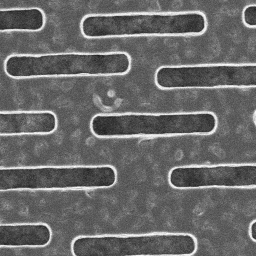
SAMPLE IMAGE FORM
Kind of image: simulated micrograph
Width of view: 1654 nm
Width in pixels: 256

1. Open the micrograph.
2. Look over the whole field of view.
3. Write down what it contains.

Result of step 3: holes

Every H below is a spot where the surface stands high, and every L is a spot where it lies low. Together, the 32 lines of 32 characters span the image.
HHHHHHHHHHHHHHHHHHHHHHHHHHHHHHHH
LLLLLHHHHHHHHHHHHHHHHHHHHHHHHHHL
LLLLLLHHHHLLLLLLLLLLLLLLLLHHHHHL
LLLLLHHHHHLLLLLLLLLLLLLLLLHHHHHH
HHHHHHHHHHHLLLLHHHHHHHHHHHHHHHHH
HHHHHHHHHHHHHHHHHHHHHHHHHHHHHHHH
HHHHHHHHHHHHHHHHHHHHHHHHHHHHHHHH
HLLLLLLLLLLLLLLLHHHHHHHHHHHHHHHH
HLLLLLLLLLLLLLLLHHHHLLLLLLLLLLLL
HHLLLHLLHHHHHHHHHHHHLLLLLLLLLLLL
HHHHHHHHHHHHHHHHHHHHLLLLLLLLLLLL
HHHHHHHHHHHHHHHHHHHHHHHHHHHHHHHH
HHHHHHHHHHHHHHHHHHHHHHHHHHHHHHHH
HHHHHHHHHHHHHHHHHHHHHHHHHHHHHHHH
LLLLLLLHHHHHLLLLLLLLLLLLLLLHHHHH
LLLLLLLHHHHHLLLLLLLLLLLLLLLHHHHH
LLLLLLHHHHHHLLLLLLLLLLLLLLHHHHHH
HHHHHHHHHHHHHHHHHHHHHHHHHHHHHHHH
HHHHHHHHHHHHHHHHHHHHHHHHHHHHHHHH
HHHHHHHHHHHHHHHHHHHHHHHHHHHHHHHH
HHHHHHHHHHHHHHHHHHHHHHHHHHHHHHHH
LLLLLLLLLLLLLLHHHHHHHLLLLLLLLLLL
LLLLLLLLLLLLLLHHHHHHHLLLLLLLLLLL
LLLLLLLLLHHHHHHHHHHHHHHLLHHHHHHH
HHHHHHHHHHHHHHHHHHHHHHHHHHHHHHHH
HHHHHHHHHHHHHHHHHHHHHHHHHHHHHHHH
HHHHHHHHHHHHHHHHHHHHHHHHHHHHHHHH
HHHHHHHHHHHHHHHHHHHHHHHHHHHHHHHH
LLLLLLHHHHHHHHHHHHHHHHHHHHHHHHHL
LLLLLLHHHHHHHLLHLLLLLLLLHHHHHHHL
LLLLLLHHHLLLLLLLLLLLLLLLHHHHHHHH
HHHHHHHHHLLLLLLLLLLLLLLLHHHHHHHH